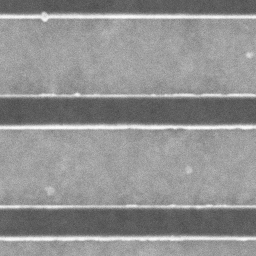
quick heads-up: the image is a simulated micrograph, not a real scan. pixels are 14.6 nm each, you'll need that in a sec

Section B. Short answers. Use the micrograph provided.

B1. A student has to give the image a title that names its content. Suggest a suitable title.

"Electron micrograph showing lines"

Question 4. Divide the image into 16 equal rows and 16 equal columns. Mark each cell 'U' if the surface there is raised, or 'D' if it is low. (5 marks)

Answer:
UUUUUUUUUUUUUUUU
DDDDDDDDDDDDDDDD
DDDDDDDDDDDDDDDD
DDDDDDDDDDDDDDDD
DDDDDDDDDDDDDDDD
DDDDDDDDDDDDDDDD
UUUUUUUUUUUUUUUU
UUUUUUUUUUUUUUUU
DDDDDDDDDDDDDDDD
DDDDDDDDDDDDDDDD
DDDDDDDDDDDDDDDD
DDDDDDDDDDDDDDDD
DDDDDDDDDDDDDDDD
UUUUUUUUUUUUUUUU
UUUUUUUUUUUUUUUU
DDDDDDDDDDDDDDDD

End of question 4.